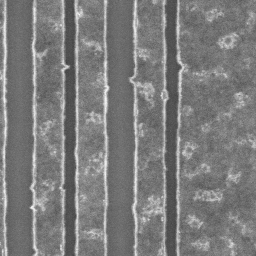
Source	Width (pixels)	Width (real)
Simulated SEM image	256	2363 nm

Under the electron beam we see parallel lines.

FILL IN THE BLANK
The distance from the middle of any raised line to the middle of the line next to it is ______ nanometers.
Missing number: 467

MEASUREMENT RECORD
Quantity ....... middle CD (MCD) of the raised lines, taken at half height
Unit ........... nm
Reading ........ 277